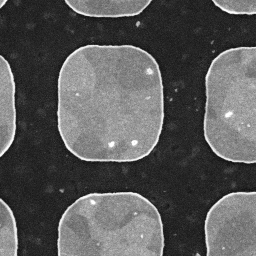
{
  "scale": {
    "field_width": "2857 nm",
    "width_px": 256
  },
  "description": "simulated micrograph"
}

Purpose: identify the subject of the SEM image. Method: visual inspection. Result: raised bodies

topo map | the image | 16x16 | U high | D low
DDDDDUUUUDDDDDUU
DDDDDDDDDDDDDDDD
DDDDDDDDDDDDDDDD
DDDDUUUUUDDDDDUU
UDDDUUUUUUDDDUUU
UDDDUUUUUUDDDUUU
UDDDUUUUUUDDDUUU
UDDDUUUUUUDDDUUU
UDDDUUUUUUDDDUUU
DDDDDUUUUDDDDDUU
DDDDDDDDDDDDDDDD
DDDDDDDDDDDDDDDD
DDDDDUUUUDDDDDUU
UDDDUUUUUUDDDUUU
UDDDUUUUUUDDDUUU
UDDDUUUUUUDDDUUU